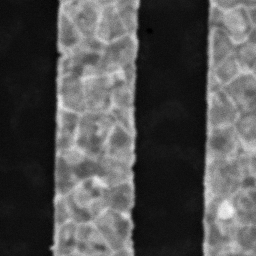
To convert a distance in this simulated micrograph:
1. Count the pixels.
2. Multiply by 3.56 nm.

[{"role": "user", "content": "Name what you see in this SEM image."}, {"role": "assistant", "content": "one or a few lines or trenches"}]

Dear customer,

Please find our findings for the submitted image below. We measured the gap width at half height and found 260 nm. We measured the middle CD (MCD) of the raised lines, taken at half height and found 276 nm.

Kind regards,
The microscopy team